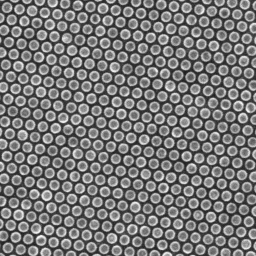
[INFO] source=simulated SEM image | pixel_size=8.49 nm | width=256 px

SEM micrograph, a regular array of raised bodies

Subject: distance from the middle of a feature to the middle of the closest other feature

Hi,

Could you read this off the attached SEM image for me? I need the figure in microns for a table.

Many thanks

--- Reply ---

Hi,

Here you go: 0.107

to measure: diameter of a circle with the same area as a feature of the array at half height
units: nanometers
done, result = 80.2